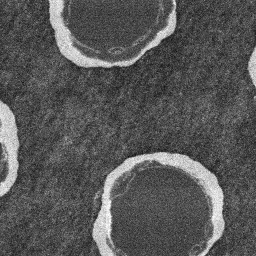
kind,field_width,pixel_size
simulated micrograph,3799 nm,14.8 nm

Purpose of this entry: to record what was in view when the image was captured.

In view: raised bodies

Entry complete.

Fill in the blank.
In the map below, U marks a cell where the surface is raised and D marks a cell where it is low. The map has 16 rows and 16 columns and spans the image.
DDDUUUUUUUUDDDDD
DDDDUUUUUUUDDDDD
DDDDUUUUUUDDDDDD
DDDDDUUUUDDDDDDD
DDDDDDDDDDDDDDDD
DDDDDDDDDDDDDDDD
DDDDDDDDDDDDDDDD
DDDDDDDDDDDDDDDD
UDDDDDDDDDDDDDDD
UDDDDDDDDDDDDDDD
UDDDDDDDUUUUDDDD
DDDDDDDUUUUUUDDD
DDDDDDDUUUUUUUDD
DDDDDDUUUUUUUUDD
DDDDDDUUUUUUUUDD
DDDDDDUUUUUUUDDD